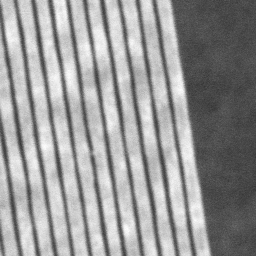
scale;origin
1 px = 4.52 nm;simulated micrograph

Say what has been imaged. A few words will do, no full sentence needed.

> parallel lines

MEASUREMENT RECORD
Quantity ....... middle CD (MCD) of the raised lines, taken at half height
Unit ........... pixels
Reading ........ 12.8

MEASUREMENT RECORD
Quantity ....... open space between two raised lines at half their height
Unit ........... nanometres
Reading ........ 19.5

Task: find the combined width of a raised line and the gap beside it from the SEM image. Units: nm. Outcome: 77.5